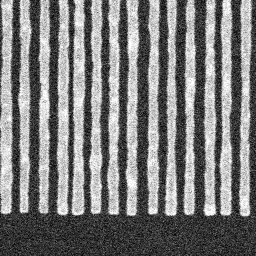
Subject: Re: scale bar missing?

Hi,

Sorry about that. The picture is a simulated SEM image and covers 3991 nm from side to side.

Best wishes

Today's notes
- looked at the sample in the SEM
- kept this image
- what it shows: parallel lines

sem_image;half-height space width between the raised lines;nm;160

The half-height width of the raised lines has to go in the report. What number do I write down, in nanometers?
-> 132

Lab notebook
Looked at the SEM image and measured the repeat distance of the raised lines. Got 287 nm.